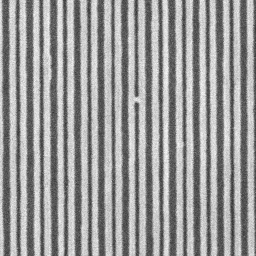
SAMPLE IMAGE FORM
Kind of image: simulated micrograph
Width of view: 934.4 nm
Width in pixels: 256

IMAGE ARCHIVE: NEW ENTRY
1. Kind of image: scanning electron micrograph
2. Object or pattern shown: parallel lines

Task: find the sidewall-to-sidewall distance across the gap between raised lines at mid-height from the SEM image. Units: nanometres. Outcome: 26.5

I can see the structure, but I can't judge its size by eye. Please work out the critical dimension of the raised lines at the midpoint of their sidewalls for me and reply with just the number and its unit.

0.0201 µm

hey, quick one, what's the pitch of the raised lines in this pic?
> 43.4 nanometers